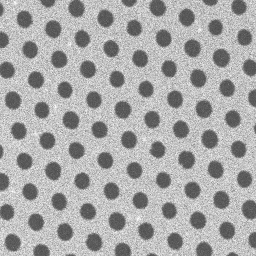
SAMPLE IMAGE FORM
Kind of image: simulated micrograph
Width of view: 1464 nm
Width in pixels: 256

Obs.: a regular array of holes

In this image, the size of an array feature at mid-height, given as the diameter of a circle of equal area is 96.1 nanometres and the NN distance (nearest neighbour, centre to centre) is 174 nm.